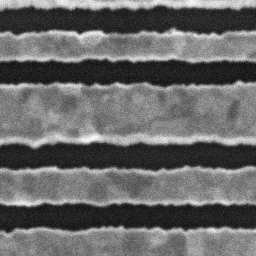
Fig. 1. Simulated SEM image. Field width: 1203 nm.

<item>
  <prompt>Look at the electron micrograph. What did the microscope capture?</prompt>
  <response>lines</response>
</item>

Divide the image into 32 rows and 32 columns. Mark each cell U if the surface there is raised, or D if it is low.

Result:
UUUDUUUUUUUUUUUUUUUUDUUUUUUUUUUU
DDDDDDDDDDDDDDDDDDDDDDDDDDDDDDDD
DDDDDDDDDDDDDDDDDDDDDDDDDDDDDDDD
DDDDDDDDDDDDDDDDDDDDDDDDDDDDDDDD
UUUUUUUUUUUUUUUUUUUUUUUUUUUUUUUU
UUUUUUUUUUUUUUUUUUUUUUUUUUUUUUUU
UUUUUUUUUUUUUUUUUUUUUUUUUUUUUUUU
UDUDUUDUUUDDDDUDUUDDDDDUUUUDDUUU
DDDDDDDDDDDDDDDDDDDDDDDDDDDDDDDD
DDDDDDDDDDDDDDDDDDDDDDDDDDDDDDDD
DDDUUDUUUDDDDDUDDUUDDDDDDDDDDUUU
UUUUUUUUUUUUUUUUUUUUUUUUUUUUUUUU
UUUUUUUUUUUUUUUUUUUUUUUUUUUUUUUU
UUUUUUUUUUUUUUUUUUUUUUUUUUUUUUUU
UUUUUUUUUUUUUUUUUUUUUUUUUUUUUUUU
UUUUUUUUUUUUUUUUUUUUUUUUUUUUUUUU
UUUUUUUUUUUUUUUUUUUUUUUUUUUUUUUU
UUUUUUUUUUUUUUUUUUUUUUUUUUUUUUUU
DDDDDDDDDDDDDDDDDDDDDDDDDDDDDDDD
DDDDDDDDDDDDDDDDDDDDDDDDDDDDDDDD
DDDDDDDDDDDDDDDDDDDDDDDDDDDDDDDD
UUUUUUUUUUUUUUUUUUUUUUUUUUUUUUUU
UUUUUUUUUUUUUUUUUUUUUUUUUUUUUUUU
UUUUUUUUUUUUUUUUUUUUUUUUUUUUUUUU
UUUUUUUUUUUUUUUUUUUUUUUUUUUUUUUU
UUUUUDUUDDDUUUDDDDUUUUUUUUDDUUUU
DDDDDDDDDDDDDDDDDDDDDDDDDDDDDDDD
DDDDDDDDDDDDDDDDDDDDDDDDDDDDDDDD
DDDDDDDDDDDDDUDDDDDDDDDDDDDDDDDD
UUUUUUUUUUUUUUUUUUUUUUUUUUUUUUUU
UUUUUUUUUUUUUUUUUUUUUUUUUUUUUUUU
UUUUUUUUUUUUUUUUUUUUUUUUUUUUUUUU